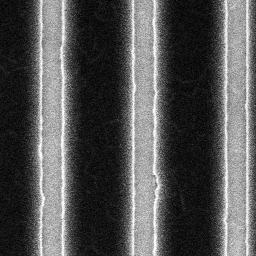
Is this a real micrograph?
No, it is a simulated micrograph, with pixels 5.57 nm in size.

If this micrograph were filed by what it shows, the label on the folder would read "one or a few lines or trenches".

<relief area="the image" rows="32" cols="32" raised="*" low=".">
*****...*********..*********...*
*****...*********..*********...*
*****...*********..*********...*
*****...*********..*********...*
*****...*********..*********...*
*****...*********..*********...*
*****...*********..*********...*
*****...*********..*********...*
*****...*********..*********...*
*****...*********..*********...*
*****...*********..*********...*
*****...*********..*********...*
*****...*********..*********...*
*****...*********..*********...*
*****...*********..*********...*
*****...*********..*********...*
*****...*********..*********...*
*****...*********..*********...*
*****...*********..*********...*
*****...*********..*********...*
*****...*********..*********...*
*****...*********..*********...*
*****...*********...********...*
*****...*********...********...*
*****...*********..*********...*
*****...*********..*********...*
*****...*********..*********...*
*****...*********..*********...*
*****...*********..*********...*
*****...*********..*********...*
*****...*********..*********...*
*****...*********..*********...*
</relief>